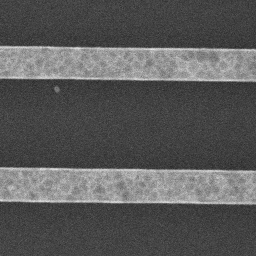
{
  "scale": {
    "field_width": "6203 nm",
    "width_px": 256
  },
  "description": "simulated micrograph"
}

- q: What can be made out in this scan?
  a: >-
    wiring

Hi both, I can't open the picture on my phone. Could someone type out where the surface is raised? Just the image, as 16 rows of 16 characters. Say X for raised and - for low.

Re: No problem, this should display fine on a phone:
----------------
----------------
----------------
XXXXXXXXXXXXXXXX
XXXXXXXXXXXXXXXX
----------------
----------------
----------------
----------------
----------------
----------------
XXXXXXXXXXXXXXXX
XXXXXXXXXXXXXXXX
----------------
----------------
----------------